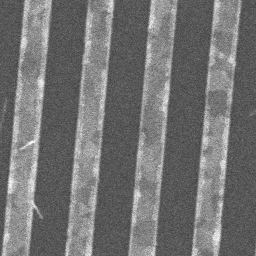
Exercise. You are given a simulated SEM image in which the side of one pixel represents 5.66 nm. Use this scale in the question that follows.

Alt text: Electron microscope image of one or a few lines or trenches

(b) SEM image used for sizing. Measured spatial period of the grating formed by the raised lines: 357 nm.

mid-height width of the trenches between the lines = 220 nanometres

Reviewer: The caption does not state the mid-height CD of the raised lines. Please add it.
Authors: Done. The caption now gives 137 nm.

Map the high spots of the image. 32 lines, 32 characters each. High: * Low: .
...***.....***.....***.....***..
...***.....***.....***.....***..
...***.....***.....***.....***..
...***.....***.....***.....***..
...***.....***.....***.....***..
...***.....***.....***....***...
...***.....***....***.....***...
...***.....**.....***.....***...
..***.....***.....***.....***...
..***.....***.....***.....***...
..***.....***.....***.....***...
..***.....***.....***.....***...
..***.....***.....***.....***...
..***.....***.....***.....***...
..***.....***.....***.....***...
..***.....***.....***.....***...
..***.....***.....***....***....
..***.....***....***.....***....
..***.....**.....***.....***....
.***......**.....***.....***....
.***.....***.....***.....***....
.***.....***.....***.....***....
.***.....***.....***.....***....
.***.....***.....***.....***....
.***.....***.....***.....***....
.***.....***.....***.....***....
.***.....***.....***.....***....
.***.....***.....***....***.....
.***.....***....***.....***.....
.***.....**.....***.....***.....
.**......**.....***.....***.....
***.....***.....***.....***.....